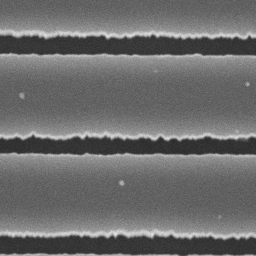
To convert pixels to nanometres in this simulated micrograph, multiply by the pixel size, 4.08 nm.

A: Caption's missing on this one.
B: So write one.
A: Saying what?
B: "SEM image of lines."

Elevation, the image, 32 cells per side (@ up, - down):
@@@@@@@@@@@@@@@@@@@@@@@@@@@@@@@@
@@@@@@@@@@@@@@@@@@@@@@@@@@@@@@@@
@@@@@@@@@@@@@@@@@@@@@@@@@@@@@@@@
@@@@@@@@@@@@@@@@@@@@@@@@@@@@@@@@
-----@@--@@--@@@@----@@@@@@@@@@@
--------------------------------
--------------------------------
@@@@@@@@@@@@@@@@@@@@@@@@@@@@@@@@
@@@@@@@@@@@@@@@@@@@@@@@@@@@@@@@@
@@@@@@@@@@@@@@@@@@@@@@@@@@@@@@@@
@@@@@@@@@@@@@@@@@@@@@@@@@@@@@@@@
@@@@@@@@@@@@@@@@@@@@@@@@@@@@@@@@
@@@@@@@@@@@@@@@@@@@@@@@@@@@@@@@@
@@@@@@@@@@@@@@@@@@@@@@@@@@@@@@@@
@@@@@@@@@@@@@@@@@@@@@@@@@@@@@@@@
@@@@@@@@@@@@@@@@@@@@@@@@@@@@@@@@
@@@@@@@@@@@@@@@@@@@@@@@@@@@@@@@@
--------------------------------
--------------------------------
@@@@@@@@@@@@@@@@@@@@@@@@@@@@@@@@
@@@@@@@@@@@@@@@@@@@@@@@@@@@@@@@@
@@@@@@@@@@@@@@@@@@@@@@@@@@@@@@@@
@@@@@@@@@@@@@@@@@@@@@@@@@@@@@@@@
@@@@@@@@@@@@@@@@@@@@@@@@@@@@@@@@
@@@@@@@@@@@@@@@@@@@@@@@@@@@@@@@@
@@@@@@@@@@@@@@@@@@@@@@@@@@@@@@@@
@@@@@@@@@@@@@@@@@@@@@@@@@@@@@@@@
@@@@@@@@@@@@@@@@@@@@@@@@@@@@@@@@
@@@@@@@@@@@@@@@@@@@@@@@@@@@@@@@@
--@--@@----@-@--------@@@@@@@@@@
--------------------------------
--------------------------------